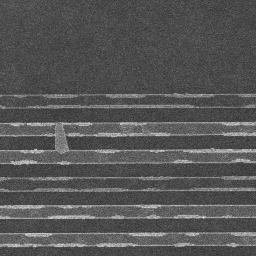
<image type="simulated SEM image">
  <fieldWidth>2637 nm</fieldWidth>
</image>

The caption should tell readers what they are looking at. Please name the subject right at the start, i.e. parallel lines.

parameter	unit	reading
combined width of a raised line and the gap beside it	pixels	27.7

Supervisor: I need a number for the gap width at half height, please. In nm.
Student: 146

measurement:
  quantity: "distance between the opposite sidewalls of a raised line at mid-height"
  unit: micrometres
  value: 0.135